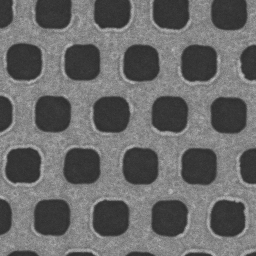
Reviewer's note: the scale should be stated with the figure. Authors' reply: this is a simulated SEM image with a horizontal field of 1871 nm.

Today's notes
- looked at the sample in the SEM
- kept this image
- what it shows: a regular array of holes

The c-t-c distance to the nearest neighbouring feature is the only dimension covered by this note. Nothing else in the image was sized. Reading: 427 nm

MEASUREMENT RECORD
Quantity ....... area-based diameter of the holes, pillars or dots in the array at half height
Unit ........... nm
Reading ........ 279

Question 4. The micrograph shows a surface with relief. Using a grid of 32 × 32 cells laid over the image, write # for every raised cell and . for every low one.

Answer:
..###....###....###.....##.....#
..##.....###....###.....##.....#
.####....###....###.....##.....#
######..#####..#####...####...##
################################
##..############################
#....###....####....###....###..
#....###.....##.....###....###..
#....###.....##.....###....###..
#....###....####....###....####.
################################
################################
.####...####....###....####...##
..##.....###....###....###.....#
..##.....###....###....###.....#
.###.....###....###....###.....#
######.######..######..####...##
################################
###.#############.######.#######
#....###....####....###....###..
#....###.....##.....###....###..
#....###.....##.....###....###..
#....###....####...####....###..
################################
################################
.####...####....###....####...##
.###.....###....###....###....##
..##.....###....###....###.....#
.###.....###....###....###....##
#############..######.######.###
################################
##..#####..######.##############